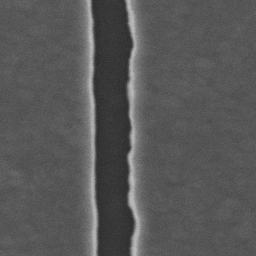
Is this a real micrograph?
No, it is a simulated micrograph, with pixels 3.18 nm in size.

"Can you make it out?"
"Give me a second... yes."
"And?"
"one or a few lines or trenches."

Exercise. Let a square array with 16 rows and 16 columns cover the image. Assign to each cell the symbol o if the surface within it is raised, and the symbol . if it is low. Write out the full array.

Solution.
oooooo..oooooooo
oooooo..oooooooo
oooooo..oooooooo
oooooo..oooooooo
oooooo..oooooooo
oooooo..oooooooo
oooooo..oooooooo
oooooo..oooooooo
oooooo..oooooooo
oooooo..oooooooo
oooooo..oooooooo
oooooo..oooooooo
oooooo..oooooooo
oooooo..oooooooo
oooooo..oooooooo
oooooo..oooooooo